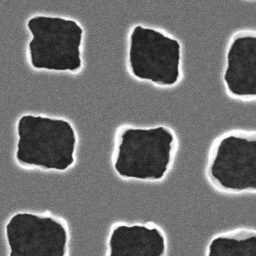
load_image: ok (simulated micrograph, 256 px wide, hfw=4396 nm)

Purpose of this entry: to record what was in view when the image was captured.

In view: holes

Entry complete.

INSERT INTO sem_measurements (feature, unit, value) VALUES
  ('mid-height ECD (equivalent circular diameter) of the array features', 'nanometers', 961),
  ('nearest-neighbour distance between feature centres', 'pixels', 98.3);